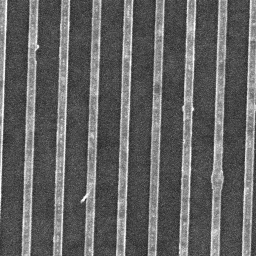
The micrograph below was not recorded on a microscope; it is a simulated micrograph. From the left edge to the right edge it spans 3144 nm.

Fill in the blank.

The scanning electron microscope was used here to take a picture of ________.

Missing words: parallel lines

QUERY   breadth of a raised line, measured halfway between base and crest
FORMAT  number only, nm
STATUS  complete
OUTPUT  98.2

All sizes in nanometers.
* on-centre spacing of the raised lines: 386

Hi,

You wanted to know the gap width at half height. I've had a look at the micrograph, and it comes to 295 nm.